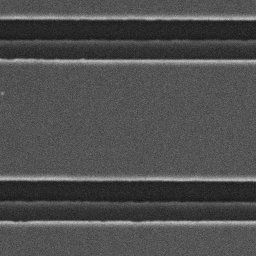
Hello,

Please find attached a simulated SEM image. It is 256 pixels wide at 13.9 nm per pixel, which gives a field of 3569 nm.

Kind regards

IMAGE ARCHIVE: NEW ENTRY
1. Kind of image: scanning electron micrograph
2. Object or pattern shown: lines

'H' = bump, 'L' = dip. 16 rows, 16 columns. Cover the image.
HHHHHHHHHHHHHHHH
LLLLLLLLLLLLLLLL
LLLLLLLLLLLLLLLL
LLLLLLLLLLLLLLLL
HHHHHHHHHHHHHHHH
HHHHHHHHHHHHHHHH
HHHHHHHHHHHHHHHH
HHHHHHHHHHHHHHHH
HHHHHHHHHHHHHHHH
HHHHHHHHHHHHHHHH
HHHHHHHHHHHHHHHH
LLLLLLLLLLLLLLLL
LLLLLLLLLLLLLLLL
LLLLLLLLLLLLLLLL
HHHHHHHHHHHHHHHH
HHHHHHHHHHHHHHHH